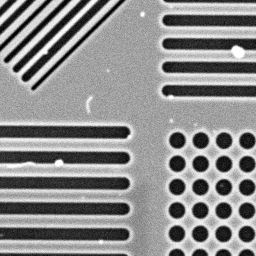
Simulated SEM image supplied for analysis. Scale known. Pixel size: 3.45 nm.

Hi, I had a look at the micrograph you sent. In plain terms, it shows groups of lines, slits or small figures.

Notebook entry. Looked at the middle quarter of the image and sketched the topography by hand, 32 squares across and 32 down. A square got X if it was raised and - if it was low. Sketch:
XXXXXXXXXXXXXXXXXXXXXXXX--------
XXXXXXXXXXXXXXXXXXXXXXXXX-------
XXXXXXXXXXXXXXXXXXXXXXXXXXXXXXXX
XXXXXXXXXXXXXXXXXXXXXXXXXXXXXXXX
XXXXXXXXXXXXXXXXXXXXXXXXXXXXXXXX
XXXXXXXXXXXXXXXXXXXXXXXXX-------
XXXXXXXXXXXXXXXXXXXXXXXX--------
XXXXXXXXXXXXXXXXXXXXXXXXX-------
XXXXXXXXXXXXXXXXXXXXXXXXXXXXXXXX
XXXXXXXXXXXXXXXXXXXXXXXXXXXXXXXX
XXXXXXXXXXXXXXXXXXXXXXXXXXXXXXXX
XXXXXXXXXXXXXXXXXXXXXXXXXXXXXXXX
XXXXXXXXXXXXXXXXXXXXXXXXXXXXXXXX
XXXXXXXXXXXXXXXXXXXXXXXXXXXXXXXX
XXXXXXXXXXXXXXXXXXXXXXXXXXXXXXXX
---------------XXXXXXXXXXXXXXXXX
----------------XXXXXXXXXXXXXXXX
----------------XXXXXXXXXXX---XX
----------------XXXXXXXXXX----XX
XXXXXXXXXXXXXXXXXXXXXXXXXX----XX
XXXXXXXXXXXXXXXXXXXXXXXXXXX---XX
XXXXXXXXXXXXXXXXXXXXXXXXXXXXXXXX
----------------XXXXXXXXXXXXXXXX
-----------------XXXXXXXXXX---XX
----------------XXXXXXXXXX----XX
XXXXXXXXXXXXXXXXXXXXXXXXXX----XX
XXXXXXXXXXXXXXXXXXXXXXXXXXX---XX
XXXXXXXXXXXXXXXXXXXXXXXXXXXXXXXX
----------------XXXXXXXXXXXXXXXX
-----------------XXXXXXXXXX---XX
----------------XXXXXXXXXX----XX
XXXXXXXXXXXXXXXXXXXXXXXXXX----XX